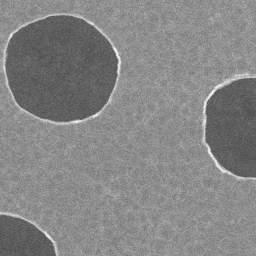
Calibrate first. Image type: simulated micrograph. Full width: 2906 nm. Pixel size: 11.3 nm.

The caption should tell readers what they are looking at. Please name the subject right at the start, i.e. holes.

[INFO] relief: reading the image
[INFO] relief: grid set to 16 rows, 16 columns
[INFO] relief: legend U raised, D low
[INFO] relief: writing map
UUUUUUUUUUUUUUUU
UUDDDDUUUUUUUUUU
UDDDDDDUUUUUUUUU
DDDDDDDUUUUUUUUU
DDDDDDDUUUUUUUUU
UDDDDDDUUUUUUUDD
UDDDDDDUUUUUUDDD
UUUDDUUUUUUUUDDD
UUUUUUUUUUUUUDDD
UUUUUUUUUUUUUDDD
UUUUUUUUUUUUUUDD
UUUUUUUUUUUUUUUU
UUUUUUUUUUUUUUUU
DUUUUUUUUUUUUUUU
DDDUUUUUUUUUUUUU
DDDUUUUUUUUUUUUU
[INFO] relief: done